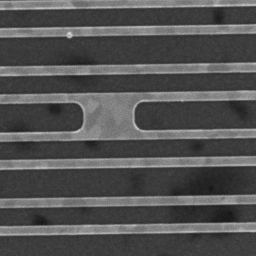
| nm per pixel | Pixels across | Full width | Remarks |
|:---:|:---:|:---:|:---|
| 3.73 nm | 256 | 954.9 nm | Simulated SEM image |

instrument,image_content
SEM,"parallel lines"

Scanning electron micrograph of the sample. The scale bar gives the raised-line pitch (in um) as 0.123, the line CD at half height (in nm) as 33.6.